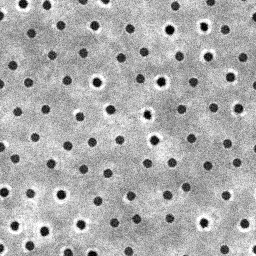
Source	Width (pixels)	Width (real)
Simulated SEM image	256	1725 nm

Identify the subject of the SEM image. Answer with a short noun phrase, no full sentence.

a regular array of holes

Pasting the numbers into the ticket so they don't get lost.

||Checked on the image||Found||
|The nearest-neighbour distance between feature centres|24.8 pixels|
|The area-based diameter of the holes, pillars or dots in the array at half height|66.3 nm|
